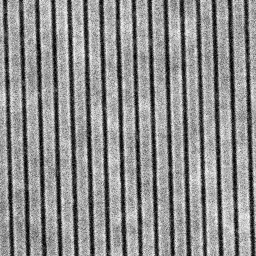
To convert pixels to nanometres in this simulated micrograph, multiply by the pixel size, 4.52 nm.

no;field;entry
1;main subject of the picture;parallel lines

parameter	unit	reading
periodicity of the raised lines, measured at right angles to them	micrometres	0.0726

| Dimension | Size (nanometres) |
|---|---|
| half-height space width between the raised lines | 25.4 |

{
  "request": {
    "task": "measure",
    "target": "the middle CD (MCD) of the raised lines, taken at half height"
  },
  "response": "46.3 nm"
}